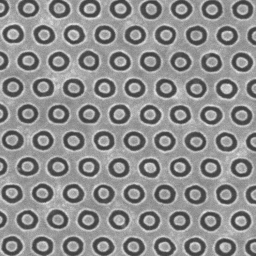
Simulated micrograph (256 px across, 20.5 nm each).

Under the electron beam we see a regular array of ring-shaped grooves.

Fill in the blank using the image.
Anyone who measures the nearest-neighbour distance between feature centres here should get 0.612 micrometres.